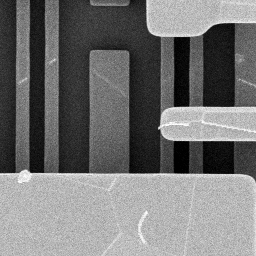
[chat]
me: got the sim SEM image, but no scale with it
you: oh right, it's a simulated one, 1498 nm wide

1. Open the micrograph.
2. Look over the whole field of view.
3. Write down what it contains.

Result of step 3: wiring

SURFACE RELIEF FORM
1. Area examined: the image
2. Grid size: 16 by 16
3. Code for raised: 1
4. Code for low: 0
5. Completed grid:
0000000001111111
0000000001111100
0000000000000000
0000000000000000
0000000000000000
0000000000000000
0000000000000000
0000000000111111
0000000000111111
0000000000000000
0000000000000000
1111111111111111
1111111111111111
1111111111111111
1111111111111111
1111111111111111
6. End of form